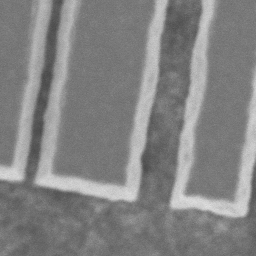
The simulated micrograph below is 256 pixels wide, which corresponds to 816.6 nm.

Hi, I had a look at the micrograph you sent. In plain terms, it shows one or a few lines or trenches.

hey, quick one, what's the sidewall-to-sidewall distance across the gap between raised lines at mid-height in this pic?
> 148 nanometers